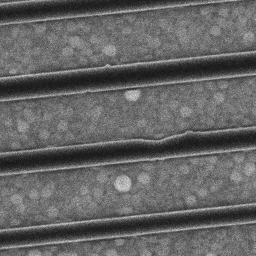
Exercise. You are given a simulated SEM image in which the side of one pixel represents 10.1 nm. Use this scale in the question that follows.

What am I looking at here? one or a few lines or trenches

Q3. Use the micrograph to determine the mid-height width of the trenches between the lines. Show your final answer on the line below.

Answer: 0.532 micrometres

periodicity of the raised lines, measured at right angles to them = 751 nanometres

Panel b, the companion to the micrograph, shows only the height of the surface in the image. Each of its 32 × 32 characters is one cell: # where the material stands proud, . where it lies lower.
#########################.......
################................
######..........................
................................
................................
................................
................................
......................##########
............####################
...###########################..
####################............
##########......................
#...............................
................................
................................
................................
.......................#.#######
................##..############
.......#########################
#######################.........
#############...................
####............................
................................
................................
................................
................................
......................##########
............####################
...#####################........
################................
#####...........................
................................